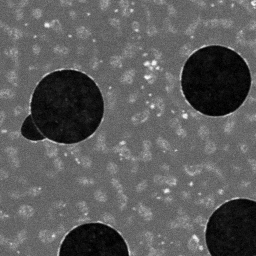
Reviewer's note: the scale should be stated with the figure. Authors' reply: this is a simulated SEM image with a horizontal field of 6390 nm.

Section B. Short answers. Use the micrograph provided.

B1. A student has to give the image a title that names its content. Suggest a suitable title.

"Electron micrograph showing holes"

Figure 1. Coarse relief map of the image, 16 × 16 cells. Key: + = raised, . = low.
++++++++++++++++
++++++++++++++++
++++++++++++++++
++++++++++++...+
+++..++++++.....
++....+++++.....
++....++++++...+
++....++++++++++
++....++++++++++
++++++++++++++++
++++++++++++++++
++++++++++++++++
+++++++++++++++.
+++++++++++++...
++++...++++++...
++++....+++++...